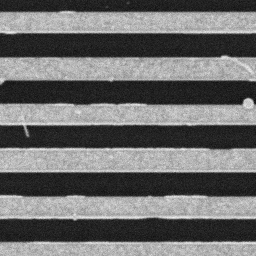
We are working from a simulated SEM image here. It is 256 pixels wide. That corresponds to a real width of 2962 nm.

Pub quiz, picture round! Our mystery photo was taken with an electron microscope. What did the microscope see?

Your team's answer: lines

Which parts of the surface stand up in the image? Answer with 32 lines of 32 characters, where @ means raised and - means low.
--------------------------------
-------@@-----------------------
@@@@@@@@@@@@@@@@@@@@@@@@@@@@@@@@
@@@@@@@@@@@@@@@@@@@@@@@@@@@@@@@@
--------------------------------
--------------------------------
--------------------------------
@@@@@@@@@@@@@@@@@@@@@@@@@@@@@@@@
@@@@@@@@@@@@@@@@@@@@@@@@@@@@@@@@
@@@@@@@@@@@@@@@@@@@@@@@@@@@@@@@@
--------------------------------
--------------------------------
--------------------------------
@@@@@@@@@@@@@@@@@@@@@@@@@@@@@@@@
@@@@@@@@@@@@@@@@@@@@@@@@@@@@@@@@
@@@@@@@@@@@@@@@@@@@@@@@@@@@@@@@@
--------------------------------
--------------------------------
--------------------------------
@@@@@@@@@@@@@@@@@@@@@@@@@@@@@@@@
@@@@@@@@@@@@@@@@@@@@@@@@@@@@@@@@
--------------------------------
--------------------------------
--------------------------------
--------------------------------
@@@@@@@@@@@@@@@@@@@@@@@@@@@@@@@@
@@@@@@@@@@@@@@@@@@@@@@@@@@@@@@@@
--------------------------------
--------------------------------
--------------------------------
@@@@@@@@@@@@@@@@@@@@@@@@@@@@@@@@
@@@@@@@@@@@@@@@@@@@@@@@@@@@@@@@@